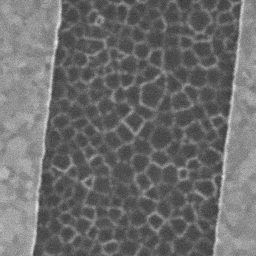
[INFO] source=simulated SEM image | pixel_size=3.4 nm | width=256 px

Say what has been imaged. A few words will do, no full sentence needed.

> one or a few lines or trenches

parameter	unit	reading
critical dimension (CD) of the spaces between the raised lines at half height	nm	616